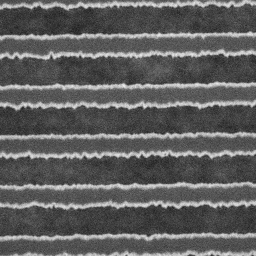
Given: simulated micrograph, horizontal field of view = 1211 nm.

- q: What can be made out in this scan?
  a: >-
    lines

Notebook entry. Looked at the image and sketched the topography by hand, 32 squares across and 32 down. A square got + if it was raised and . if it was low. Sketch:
++++++++++++++++++++++++++.+++.+
................................
................................
................................
++++++++++++++++++++++++++++++++
++++++++++++++++++++++++++++++++
++++++++++++++++++++++++++++++++
................................
................................
................................
..........................++++++
++++++++++++++++++++++++++++++++
++++++++++++++++++++++++++++++++
................+...............
................................
................................
................................
++++++++++++++++++++++++++++++++
++++++++++++++++++++++++++++++++
+++++++++++++..+..........+.....
................................
................................
................................
++++++++++++++++++++++++++++++++
++++++++++++++++++++++++++++++++
++++++++++++++++++++++++++++++++
................................
................................
................................
.........+++++++++.+++++++++++++
++++++++++++++++++++++++++++++++
++++++++++++++++++++++++++++++++